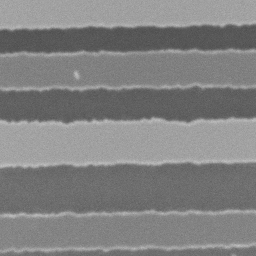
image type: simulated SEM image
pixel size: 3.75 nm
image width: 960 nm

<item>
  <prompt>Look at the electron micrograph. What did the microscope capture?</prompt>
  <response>lines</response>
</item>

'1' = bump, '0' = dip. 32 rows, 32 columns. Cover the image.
11111111111111111111111111111111
11111111111111111111111111111111
11111111111111111111111111111111
11111111100000000000000000000000
00000000000000000000000000000000
00000000000000000000000000000000
00000000001001000011111111111111
11111111111111111111111111111111
11111111111111111111111111111111
11111111111111111111111111111111
11111111111111111111111111111111
00000000000000000000000000000000
00000000000000000000000000000000
00000000000000000000000000000000
00000000000000000000000000000000
11111111011111111111111111111111
11111111111111111111111111111111
11111111111111111111111111111111
11111111111111111111111111111111
11111111111111111111111111111111
11111110011111000001000000000000
00000000000000000000000000000000
00000000000000000000000000000000
00000000000000000000000000000000
00000000000000000000000000000000
00000000000000000000000000000000
00000000000000000011010110011111
11111111111111111111111111111111
11111111111111111111111111111111
11111111111111111111111111111111
11111111111111111111111111111111
00000000000000000000000000000000